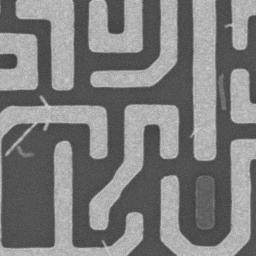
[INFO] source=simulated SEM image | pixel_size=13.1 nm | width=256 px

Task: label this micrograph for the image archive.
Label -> wiring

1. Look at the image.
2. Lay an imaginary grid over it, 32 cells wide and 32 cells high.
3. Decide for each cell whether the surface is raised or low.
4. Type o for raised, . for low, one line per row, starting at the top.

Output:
..ooooooo..oo...oo..oo..ooo..ooo
..ooooooo..oo...oo..oo..ooo..ooo
......ooo..oo...oo..oo..ooo..oo.
.......oo..oo...oo..oo..ooo..oo.
oooo..ooo..ooooooo..oo..ooo..oo.
ooooo.ooo..ooooooo..oo..ooo..oo.
ooooo..oo...........oo..ooo.....
..ooo..oo...........oo..ooo.....
..ooo..oo..........oo...ooo.....
ooooo..oo..ooooooooo....ooo..oo.
ooooo..oo...ooooooo.....ooo..oo.
........................ooo..oo.
........................ooo..oo.
.oooooooooooo...oooooo..ooo..ooo
ooooooooooooo...oooooo..ooo..ooo
oo.........oo...oooooo..ooo.....
o..........oo...oo..oo..ooo.....
...........oo...oo..oo..ooo...oo
.......oo..oo...oo..oo..ooo..ooo
.......oo...o...oo..oo..ooo..ooo
.......oo......ooo...........oo.
.......oo......oo............oo.
.......oo.....oo....oo...oo..oo.
.......oo....oo.....oo...oo..oo.
.......oo...ooo.....oo...oo..oo.
.......oo..ooo......oo...oo..oo.
.......oo..ooo......oo...oo..oo.
.......oo..oo...oo..oo...oo..oo.
.......oo...o...oo..oo...o...oo.
.......oo......ooo..ooo.....ooo.
.......oo.....ooo....ooo...oooo.
oooooooooooooooo......oooooooo..